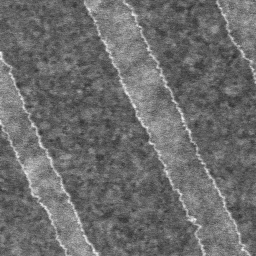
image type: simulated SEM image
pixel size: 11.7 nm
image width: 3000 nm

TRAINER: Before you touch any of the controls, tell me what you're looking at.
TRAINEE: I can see one or a few lines or trenches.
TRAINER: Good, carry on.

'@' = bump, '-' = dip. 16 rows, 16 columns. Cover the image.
@@@@@---@@@@@@--
@@@@@@---@@@@@--
@@@@@@---@@@@@@-
@@@@@@@---@@@@@-
-@@@@@@---@@@@@@
-@@@@@@@--@@@@@@
-@@@@@@@---@@@@@
--@@@@@@@--@@@@@
--@@@@@@@---@@@@
@--@@@@@@@--@@@@
@--@@@@@@@---@@@
@@--@@@@@@@--@@@
@@--@@@@@@@---@@
@@@--@@@@@@@--@@
@@@--@@@@@@@---@
@@@@--@@@@@@@--@